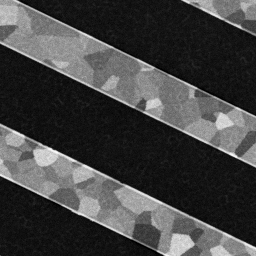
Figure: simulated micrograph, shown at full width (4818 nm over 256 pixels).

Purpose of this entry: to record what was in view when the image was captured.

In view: one or a few lines or trenches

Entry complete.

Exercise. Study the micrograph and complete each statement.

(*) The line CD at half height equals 0.839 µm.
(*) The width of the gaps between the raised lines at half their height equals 1.38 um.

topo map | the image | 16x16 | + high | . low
++..........++++
++++...........+
++++++..........
..++++++........
....++++++......
......++++++....
........++++++..
..........++++++
+...........++++
++++..........++
++++++..........
.+++++++........
...+++++++......
.....+++++++....
.......+++++++..
.........+++++++